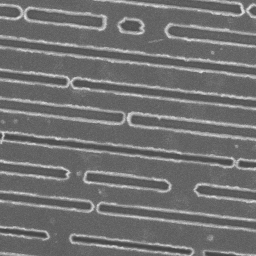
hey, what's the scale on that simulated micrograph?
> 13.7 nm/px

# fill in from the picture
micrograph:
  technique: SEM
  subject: parallel lines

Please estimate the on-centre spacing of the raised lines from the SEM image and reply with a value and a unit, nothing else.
423 nm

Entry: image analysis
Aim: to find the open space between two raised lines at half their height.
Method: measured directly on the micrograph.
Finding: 114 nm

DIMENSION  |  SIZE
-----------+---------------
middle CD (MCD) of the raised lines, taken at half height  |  309 nanometres